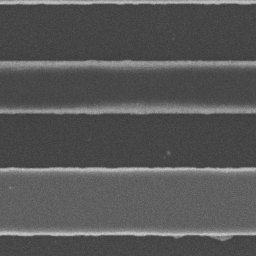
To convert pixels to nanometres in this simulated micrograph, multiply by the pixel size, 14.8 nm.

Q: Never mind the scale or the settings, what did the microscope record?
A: lines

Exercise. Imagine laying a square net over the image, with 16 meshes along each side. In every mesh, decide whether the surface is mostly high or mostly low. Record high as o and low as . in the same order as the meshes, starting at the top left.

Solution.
................
................
................
................
oooooooooooooooo
oooooooooooooooo
oooooooooooooooo
................
................
................
o..oooo.oo.o...o
oooooooooooooooo
oooooooooooooooo
oooooooooooooooo
oooooooooooooooo
................